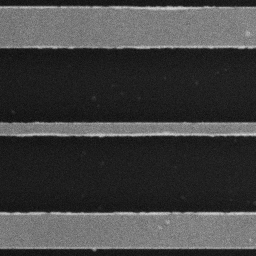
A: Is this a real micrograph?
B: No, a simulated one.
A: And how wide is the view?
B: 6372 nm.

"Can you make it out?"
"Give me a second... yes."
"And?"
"lines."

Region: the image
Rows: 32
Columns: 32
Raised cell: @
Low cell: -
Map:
--------------------------------
@@@@@@@@@@@@@@@@@@@@@@@@@@@@@@@@
@@@@@@@@@@@@@@@@@@@@@@@@@@@@@@@@
@@@@@@@@@@@@@@@@@@@@@@@@@@@@@@@@
@@@@@@@@@@@@@@@@@@@@@@@@@@@@@@@@
@@@@@@@@@@@@@@@@@@@@@@@@@@@@@@@@
--------------------------------
--------------------------------
--------------------------------
--------------------------------
--------------------------------
--------------------------------
--------------------------------
--------------------------------
--------------------------------
@@@@@@@@@@@@@@@@@@@@@@@@@@@@@@@@
@@@@@@@@@@@@@@@@@@@@@@@@@@@@@@@@
--------------------------------
--------------------------------
--------------------------------
--------------------------------
--------------------------------
--------------------------------
--------------------------------
--------------------------------
--------------------------------
--------------------------------
@@@@@@@@@@@@@@@@@@@@@@@@@@@@@@@@
@@@@@@@@@@@@@@@@@@@@@@@@@@@@@@@@
@@@@@@@@@@@@@@@@@@@@@@@@@@@@@@@@
@@@@@@@@@@@@@@@@@@@@@@@@@@@@@@@@
--------------------------------